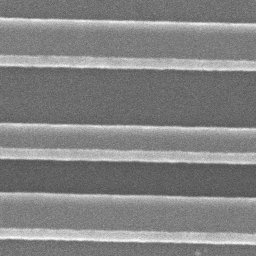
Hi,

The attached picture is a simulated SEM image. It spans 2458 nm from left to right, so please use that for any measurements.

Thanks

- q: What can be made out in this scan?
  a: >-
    lines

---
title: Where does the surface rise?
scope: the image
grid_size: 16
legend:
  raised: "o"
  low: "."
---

................
ooooooooooooo...
oooooooooooooooo
oooooooooooooooo
................
................
................
................
oooooooooooooooo
oooooooooooooooo
................
................
oooooooooooooooo
oooooooooooooooo
oooooooooooooooo
................